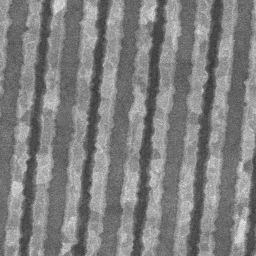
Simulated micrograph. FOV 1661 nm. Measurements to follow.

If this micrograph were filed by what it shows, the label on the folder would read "parallel lines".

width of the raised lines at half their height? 81.6 nm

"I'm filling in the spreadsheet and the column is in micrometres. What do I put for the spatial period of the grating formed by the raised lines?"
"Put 0.18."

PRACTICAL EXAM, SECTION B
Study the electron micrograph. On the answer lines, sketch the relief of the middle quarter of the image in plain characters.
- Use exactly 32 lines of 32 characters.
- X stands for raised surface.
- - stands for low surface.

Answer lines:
----XXX---XXX-----XXX---XXX-----
----XXX---XXX-----XXX---XXX-----
---XXXX---XXX-----XXX---XXX-----
---XXXX---XXX-----XXX---XXX-----
----XX---XXXX-----XXX---XXX-----
----XXX--XXXX-----XXX---XXX-----
----XXX--XXXX-----XXX---XXX-----
----XXX--XXX------XXX--XXXX-----
---XXX---XXX------XXX--XXXX----X
---XXX---XXX------XX---XXX-----X
---XXX---XXX-----XXX---XXX-----X
---XXX---XX------XXXX--XXX------
---XXX---XXX----XXXX---XX------X
---XXX---XXX-----XXX--XXX------X
---XXX---XX-----XXXX--XXX------X
---XXX--XXXX-----XXX--XXXX-----X
---XXX---XX------XXX---XX------X
---XX---XXX------XXX--XXX------X
---XX---XXX-----XXXX--XXX------X
--XXX---XXX-----XXX---XXX-----XX
--XXX---XXX-----XXX---XXX-----XX
--XXX---XXX-----XXX---XXX-----XX
--XXX---XX------XXX---XXX-----XX
--XXX---XXX-----XXX---XXX------X
--XXX---XXX-----XXX---XXX-----XX
-XXXX--XXXX----XXXX--XXX------XX
-XXXX--XXXX-----XXX--XXXX-----XX
-XXX---XXXX----XXXX--XXXX-----XX
-XXX---XXX------XXX---XX-----XXX
--XX---XXX------XXX--XXX-----XXX
-XXX---XXX-----XXX---XXX-----XXX
-XXX---XXX-----XXX----XX-----XXX